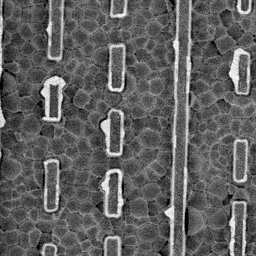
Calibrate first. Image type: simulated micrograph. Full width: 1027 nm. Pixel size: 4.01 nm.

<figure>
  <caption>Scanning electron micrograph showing one or a few lines or trenches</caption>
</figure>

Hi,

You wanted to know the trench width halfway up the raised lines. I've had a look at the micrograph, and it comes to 193 nm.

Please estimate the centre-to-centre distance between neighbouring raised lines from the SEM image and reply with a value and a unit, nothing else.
0.252 micrometres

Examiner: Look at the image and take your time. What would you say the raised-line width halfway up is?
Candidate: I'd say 55.1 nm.